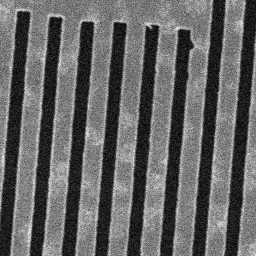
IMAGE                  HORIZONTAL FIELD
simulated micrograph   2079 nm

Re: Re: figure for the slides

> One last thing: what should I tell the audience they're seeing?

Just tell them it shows parallel lines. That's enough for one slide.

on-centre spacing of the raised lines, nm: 263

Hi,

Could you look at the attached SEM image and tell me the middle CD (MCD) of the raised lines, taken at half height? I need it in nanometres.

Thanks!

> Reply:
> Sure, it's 153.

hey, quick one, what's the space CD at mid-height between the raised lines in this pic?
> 0.111 micrometres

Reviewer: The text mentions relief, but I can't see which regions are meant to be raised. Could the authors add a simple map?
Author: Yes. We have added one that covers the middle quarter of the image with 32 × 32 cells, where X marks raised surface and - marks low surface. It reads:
XXX----XXXX----XXXXX---XXXXX---X
XXX----XXXX----XXXXX---XXXXX---X
XXX----XXXX----XXXX----XXXXX---X
XXX----XXXX----XXXX----XXXXX---X
XXX----XXXX----XXXX----XXXX----X
XXX---XXXXX---XXXXX----XXXX----X
XXX----XXXX---XXXXX---XXXXX----X
XXX---XXXXX---XXXXX----XXXX----X
XXX---XXXXX---XXXXX---XXXXX----X
XX----XXXXX---XXXXX---XXXXX----X
XXX---XXXXX---XXXXX---XXXXX---XX
XX----XXXX----XXXXX---XXXXX---XX
XX----XXXX----XXXXX---XXXXX---XX
XX----XXXX----XXXXX---XXXXX---XX
XX----XXXX----XXXX----XXXXX---XX
XX----XXXX----XXXX----XXXX----XX
XX----XXXX----XXXX----XXXXX---XX
XX---XXXXX----XXXX----XXXX----XX
XX---XXXXX----XXXX---XXXXX----XX
XX---XXXXX---XXXXX---XXXXX----XX
XX---XXXXX---XXXXX----XXXX---XXX
X----XXXXX---XXXXX---XXXXX---XXX
XX---XXXXX---XXXXX---XXXXX---XXX
X----XXXX----XXXXX---XXXXX---XXX
X----XXXX----XXXXX---XXXXX---XXX
X----XXXX----XXXX----XXXXX---XXX
X----XXXX----XXXX----XXXXX---XXX
X----XXXX----XXXX----XXXX----XXX
X----XXXX----XXXX----XXXX----XXX
X---XXXXX----XXXX----XXXX----XXX
X---XXXXX----XXXX---XXXXX----XXX
X---XXXXX---XXXXX---XXXXX----XXX